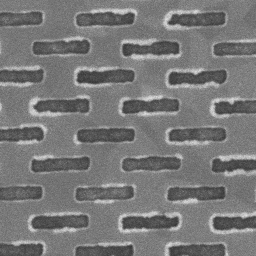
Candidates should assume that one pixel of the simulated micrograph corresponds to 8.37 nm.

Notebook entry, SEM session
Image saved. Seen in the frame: a regular array of holes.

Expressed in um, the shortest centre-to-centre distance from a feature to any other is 0.444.